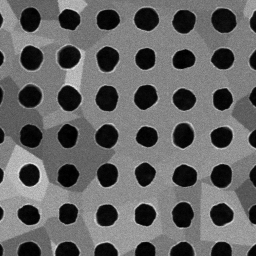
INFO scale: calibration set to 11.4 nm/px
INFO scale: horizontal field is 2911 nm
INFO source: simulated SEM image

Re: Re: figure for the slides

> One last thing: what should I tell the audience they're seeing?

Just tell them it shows a regular array of holes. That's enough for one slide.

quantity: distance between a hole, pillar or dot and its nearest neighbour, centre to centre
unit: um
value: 0.431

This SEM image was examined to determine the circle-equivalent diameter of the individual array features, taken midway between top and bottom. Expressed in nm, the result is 256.